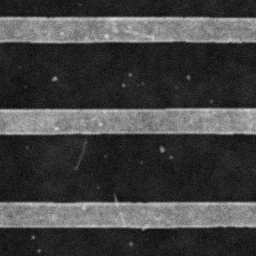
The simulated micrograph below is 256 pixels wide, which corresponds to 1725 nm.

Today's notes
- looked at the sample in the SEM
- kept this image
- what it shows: lines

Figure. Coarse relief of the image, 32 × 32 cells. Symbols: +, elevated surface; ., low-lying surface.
................................
................................
++++++++++++++++++++++++++++++++
++++++++++++++++++++++++++++++++
++++++++++++++++++++++++++++++++
................................
................................
................................
................................
................................
................................
................................
................................
................................
++++++++++++++++++++++++++++++++
++++++++++++++++++++++++++++++++
++++++++++++++++++++++++++++++++
................................
................................
................................
................................
................................
................................
................................
................................
..............+......+++++++++..
++++++++++++++++++++++++++++++++
++++++++++++++++++++++++++++++++
..................+.............
................................
................................
................................